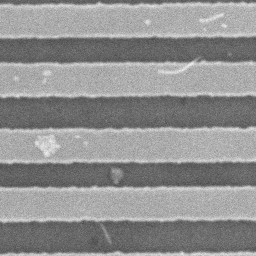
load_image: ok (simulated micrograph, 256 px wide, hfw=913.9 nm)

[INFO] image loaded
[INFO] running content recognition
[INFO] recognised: lines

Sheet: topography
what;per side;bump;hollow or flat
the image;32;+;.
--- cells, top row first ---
............+.......++++++++++++
++++++++++++++++++++++++++++++++
++++++++++++++++++++++++++++++++
++++++++++++++++++++++++++++++++
++++++++++++++++++++++++++++++++
................................
................................
................................
++++++++++++++++++++++++++++++++
++++++++++++++++++++++++++++++++
++++++++++++++++++++++++++++++++
++++++++++++++++++++++++++++++++
................................
................................
................................
................................
++++++++++++++++++++++++++++++++
++++++++++++++++++++++++++++++++
++++++++++++++++++++++++++++++++
++++++++++++++++++++++++++++++++
................................
................................
................................
....+.+.+....+.+..+.++++++++++++
++++++++++++++++++++++++++++++++
++++++++++++++++++++++++++++++++
++++++++++++++++++++++++++++++++
++++++++++.++++.++++++..+.+....+
................................
................................
................................
..............................+.